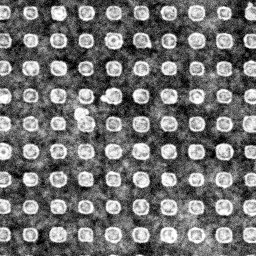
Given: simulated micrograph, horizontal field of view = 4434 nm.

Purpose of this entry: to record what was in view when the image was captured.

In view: a regular array of raised bodies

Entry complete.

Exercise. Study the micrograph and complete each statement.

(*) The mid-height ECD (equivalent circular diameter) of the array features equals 0.248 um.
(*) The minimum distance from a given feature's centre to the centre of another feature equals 0.476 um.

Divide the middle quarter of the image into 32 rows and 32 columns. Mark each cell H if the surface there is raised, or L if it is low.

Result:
LLLLHHHLLLLHHHLLLLHHHLLLLHHHLLLL
LLLLHHHLLLLHHHLLLLHHHLLLLHHHLLLL
LLLLLHLLLLLHHHLLLLLHHLLLLHHHLLLL
LLLLLLLLLLLLLLLLLLLLLLLLLLLLLLLL
LLLLLLLLLLLLLLLLLLLLLLLLLLLLLLLL
LLLLLLLLLLLLLLLLLLLLLLLLLLLLLLLL
LLLLLLLLLLLHHLLLLLLLLLLLLLLLLLLL
LLLLHHHLLLLHHHLLLLHHHLLLHHHHLLLL
LLLLHHHLLLLHHHLLLLHHHLLLHHHHLLLL
LLLLLHHLLLLHHHLLLLHHLLLLLHHHLLLL
LLLLLLLLLLLLLLLLLLLLLLLLLLLLLLLL
LLLLLLLLLLLLLLLLLLLLLLLLLLLLLLLL
LLLHHLLLLLLLLLLLLLLLLLLLLLLLLLLL
LLLLHHHLLLLLHLLLLLHHLLLLLHHLLLLL
LLLLHHHLLLLHHHLLLLHHHLLLHHHHLLLL
LLLLHHHLLLLHHHLLLLHHHLLLHHHHLLLL
LLLLHHHLLLLHHLLLLLHHHLLLLHHLLLLL
LLLLLLLLLLLLLLLLLLLLLLLLLLLLLLLL
LLLLLLLLLLLLLLLLLLLLLLLLLLLLLLLL
LLLLLLLLLLLLLLLLLLLLLLLLLLLLLLLL
LLLLHHHLLLLHHLLLLLHHHLLLLHHLLLLL
LLLLHHHLLLLHHHLLLLHHHLLLLHHHLLLH
LLLLHHHLLLLHHHLLLLHHHLLLLHHHLLLH
LLLLLLLLLLLLLLLLLLHHLLLLLLLLLLLL
LLLLLLLLLLLLLLLLLLLLLLLLLLLLLLLL
LLLLLLLLLLLLLLLLLLLLLLLLLLLLLLLL
LLLLLLLLLLLLLLLLLLLLLLLLLLLLLLLL
LLLLHHHLLLLHHLLLLLHHLLLLLLLLLLLL
LLLLHHHLLLLHHHLLLLHHHLLLLHHHLLLL
LLLLHHHLLLLHHHLLLLHHHLLLLHHHLLLL
LLLLLLLLLLLLLLLLLLLHLLLLLLLLLLLL
LLLLLLLLLLLLLLLLLLLLLLLLLLLLLLLL